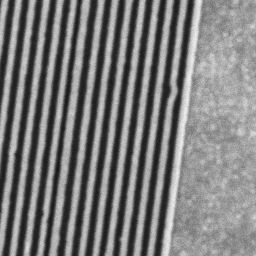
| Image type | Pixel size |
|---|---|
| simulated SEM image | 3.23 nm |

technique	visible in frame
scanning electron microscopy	parallel lines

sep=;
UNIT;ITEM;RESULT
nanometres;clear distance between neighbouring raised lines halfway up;22.4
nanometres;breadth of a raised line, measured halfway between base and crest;22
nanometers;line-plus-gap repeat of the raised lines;44.1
